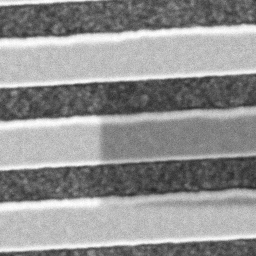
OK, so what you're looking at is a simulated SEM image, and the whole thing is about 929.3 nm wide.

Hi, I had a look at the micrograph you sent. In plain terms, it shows lines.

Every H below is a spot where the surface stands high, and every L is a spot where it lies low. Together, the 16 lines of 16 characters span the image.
LLLLLLLLLLLLLLLL
LLLLLLLLLLLLLLLL
HHHHHHHHHHHHHHHH
HHHHHHHHHHHHHHHH
HHHHHHHHHHHHHHHH
LLLLLLLLLLLLLLLL
LLLLLLLLLLLLLLLL
LLHHHHHHHHHHHHHH
HHHHHHHHHHHHHHHH
HHHHHHHHHHHHHHHH
HHHLLLLLLLLLLLLL
LLLLLLLLLLLLLLLL
LLLLHHHHHHHHHHHH
HHHHHHHHHHHHHHHH
HHHHHHHHHHHHHHHH
HHHHHLLLLLLLLLLL